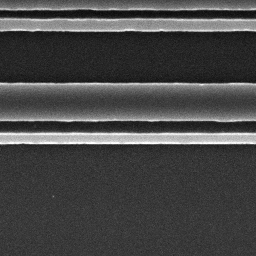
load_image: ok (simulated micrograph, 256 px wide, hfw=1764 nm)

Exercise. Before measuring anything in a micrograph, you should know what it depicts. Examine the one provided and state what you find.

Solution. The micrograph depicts lines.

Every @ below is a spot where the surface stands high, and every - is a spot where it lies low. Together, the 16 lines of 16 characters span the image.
@@@@@@@@@@@@@@@@
@@@@@@@@@@@@@@@@
----------------
----------------
----------------
@@@@@@@@@@@@@@@@
@@@@@@@@@@@@@@@@
@@@@@@@@@@@@@@@@
@@@@@@@@@@@@@@@@
----------------
----------------
----------------
----------------
----------------
----------------
----------------